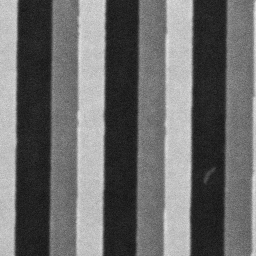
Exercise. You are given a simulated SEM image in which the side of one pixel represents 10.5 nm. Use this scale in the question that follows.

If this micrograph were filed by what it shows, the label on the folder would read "lines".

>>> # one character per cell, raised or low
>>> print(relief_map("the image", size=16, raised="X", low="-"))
X--XXXX--XXX--XX
X--XXXX--XXX--XX
X--XXXX--XXX--XX
X--XXXX--XXX--XX
X--XXXX--XXX--XX
X--XXXX--XXX--XX
X--XXXX--XXX--XX
X--XXXX--XXX--XX
X--XXXX--XXX--XX
X--XXX---XXX--XX
X--XXX---XXX--XX
X--XXX---XXX--XX
X--XXX---XXX--XX
X--XXX---XXX--XX
X--XXX---XXX--XX
X--XXX---XXX--XX